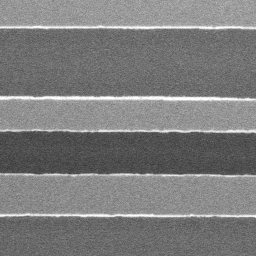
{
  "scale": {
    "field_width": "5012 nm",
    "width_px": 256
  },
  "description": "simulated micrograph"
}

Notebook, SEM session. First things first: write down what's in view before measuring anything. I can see lines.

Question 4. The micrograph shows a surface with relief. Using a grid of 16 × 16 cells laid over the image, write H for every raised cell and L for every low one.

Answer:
HHHHHHHHHHHHHHHH
HHHHHHHHHHHHHHHH
LLLLLLLLLLLLLLLL
LLLLLLLLLLLLLLLL
LLLLLLLLLLLLLLLL
LLLLLLLLLLLLLLLL
HHHHHHHHHHHHHHHH
HHHHHHHHHHHHHHHH
LLLLLLLLLLLLLLLL
LLLLLLLLLLLLLLLL
LLLLLLLLLLLLLLLL
HHHHHHHHHHHHHHHH
HHHHHHHHHHHHHHHH
LLLLLLLLLLLLLLHL
LLLLLLLLLLLLLLLL
LLLLLLLLLLLLLLLL